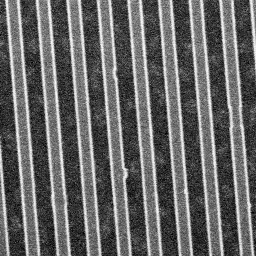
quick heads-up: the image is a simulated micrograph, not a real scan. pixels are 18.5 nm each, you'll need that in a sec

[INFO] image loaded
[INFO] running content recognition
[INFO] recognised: parallel lines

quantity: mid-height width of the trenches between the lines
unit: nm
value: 329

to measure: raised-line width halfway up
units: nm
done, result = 228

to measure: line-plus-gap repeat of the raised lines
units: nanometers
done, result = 563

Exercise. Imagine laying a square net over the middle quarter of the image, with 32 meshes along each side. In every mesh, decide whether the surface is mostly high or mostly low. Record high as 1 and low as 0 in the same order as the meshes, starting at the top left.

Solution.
00111000001110000011000001110000
00111000001110000011100001110000
00111000001110000011100001110000
00111000001110000011100001110000
00011000001110000011100001110000
00011100001110000011100000110000
00011100001110000011100000111000
00011100001110000011100000111000
00011100001110000011100000111000
00011100000110000011100000111000
00011100000111000011100000111000
00011100000111000011100000111000
00011100000111000001100000111000
00011100000111000001100000111000
00011100000111000001110000111000
00011100000111000001110000111000
00001100000111000001110000111000
00001110000111000001110000111000
00001110000111000001110000011000
00001110000111000001110000011100
00001110000111000001110000011100
00001110000111000001110000011100
00001110000011000001110000011100
00001110000011100001110000011100
00001110000011100000110000011100
00001110000011100000111000011100
00001110000011100000111000011100
00001110000011110000111000011100
00000110000011100000111000011100
00000111000011100000111000011100
00000111000011100000111000001100
00000111000011100000111000001110